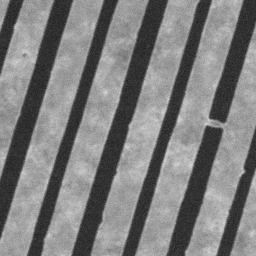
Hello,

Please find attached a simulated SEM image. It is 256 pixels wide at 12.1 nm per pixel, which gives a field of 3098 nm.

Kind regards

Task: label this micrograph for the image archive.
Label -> parallel lines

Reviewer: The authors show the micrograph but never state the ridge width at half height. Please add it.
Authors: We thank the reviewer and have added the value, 346 nm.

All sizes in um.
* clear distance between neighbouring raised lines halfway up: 0.219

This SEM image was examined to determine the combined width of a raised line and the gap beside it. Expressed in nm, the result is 546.